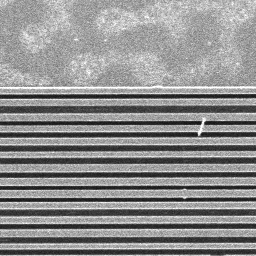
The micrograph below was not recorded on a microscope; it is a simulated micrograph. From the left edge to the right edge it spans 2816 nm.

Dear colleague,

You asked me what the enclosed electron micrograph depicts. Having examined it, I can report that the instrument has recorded parallel lines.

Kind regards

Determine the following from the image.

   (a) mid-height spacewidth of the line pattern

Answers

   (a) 53.6 nanometers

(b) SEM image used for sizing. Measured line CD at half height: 85.2 nanometres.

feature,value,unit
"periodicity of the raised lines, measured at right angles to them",0.142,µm